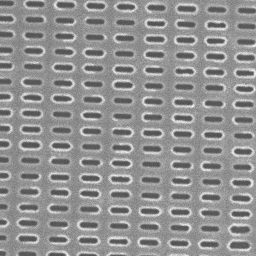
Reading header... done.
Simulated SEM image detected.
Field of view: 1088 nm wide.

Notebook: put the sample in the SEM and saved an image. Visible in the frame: a regular array of holes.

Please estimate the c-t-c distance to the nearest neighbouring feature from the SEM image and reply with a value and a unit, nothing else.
66.3 nanometres